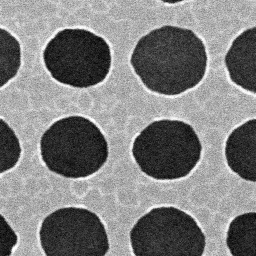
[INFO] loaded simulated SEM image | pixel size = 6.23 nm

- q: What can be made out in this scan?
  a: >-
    holes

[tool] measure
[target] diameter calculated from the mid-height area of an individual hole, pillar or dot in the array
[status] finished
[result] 0.401 micrometres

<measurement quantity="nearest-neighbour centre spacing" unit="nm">558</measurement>